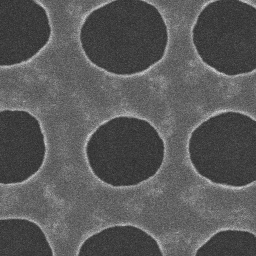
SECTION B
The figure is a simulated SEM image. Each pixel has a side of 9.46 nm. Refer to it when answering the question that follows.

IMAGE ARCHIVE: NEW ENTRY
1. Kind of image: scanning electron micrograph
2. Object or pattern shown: holes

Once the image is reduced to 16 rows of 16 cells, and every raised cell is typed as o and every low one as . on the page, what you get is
...ooo....ooo...
...oo.....oo....
...oo.....oo....
..ooo.....oo....
ooooooo..ooooo..
oooooooooooooooo
oooooooooooooooo
..ooooo..oooo...
...ooo....oo....
...oo.....oo....
..oooo....oo....
.oooooo..ooooo..
oooooooooooooooo
oooooooooooooooo
...ooo...ooooo.o
...oo.....ooo...